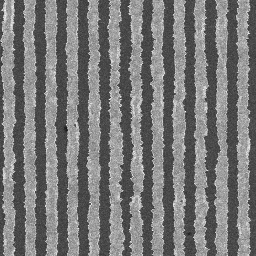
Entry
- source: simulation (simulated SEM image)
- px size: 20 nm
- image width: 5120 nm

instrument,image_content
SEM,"parallel lines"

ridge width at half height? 205 nm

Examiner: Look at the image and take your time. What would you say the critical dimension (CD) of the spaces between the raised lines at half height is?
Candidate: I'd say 218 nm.